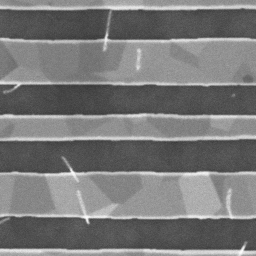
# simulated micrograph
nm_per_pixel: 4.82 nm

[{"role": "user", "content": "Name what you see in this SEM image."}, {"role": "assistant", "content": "lines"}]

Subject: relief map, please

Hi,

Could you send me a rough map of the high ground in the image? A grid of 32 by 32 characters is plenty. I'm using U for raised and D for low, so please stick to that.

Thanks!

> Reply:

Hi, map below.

UUUUUUUUUUUUUUUUUUUUUUUUUUUUUUUU
DDDDDDDDDDDDDDDDDDDDDDDDDDDDDDDD
DDDDDDDDDDDDDDDDDDDDDDDDDDDDDDDD
DDDDDDDDDDDDDDDDDDDDDDDDDDDDDDDD
DDDDDDDDDDDDDDDDDDDDDDDDDDDDDDDD
UUUUUUUUUUUUUUUUUUUUUUUUUUUUUUUU
UUUUUUUUUUUUUUUUUUUUUUUUUUUUUUUU
UUUUUUUUUUUUUUUUUUUUUUUUUUUUUUUU
UUUUUUUUUUUUUUUUUUUUUUUUUUUUUUUU
UUUUUUUUUUUUUUUUUUUUUUUUUUUUUUUU
DDDDDDDDDDDDDDDUUDDDUUUUUUUUUDUU
DDDDDDDDDDDDDDDDDDDDDDDDDDDDDDDD
DDDDDDDDDDDDDDDDDDDDDDDDDDDDDDDD
DDDDDDDDDDDDDDDDDDDDDDDDDDDDDDDD
UUDDDDDDDDDDUUUUUUUUUUUDDDDDDDDD
UUUUUUUUUUUUUUUUUUUUUUUUUUUUUUUU
UUUUUUUUUUUUUUUUUUUUUUUUUUUUUUUU
DDDDDDDDDDDDDDDDDDDDDDDDDDDDDDDD
DDDDDDDDDDDDDDDDDDDDDDDDDDDDDDDD
DDDDDDDDDDDDDDDDDDDDDDDDDDDDDDDD
DDDDDDDDDDDDDDDDDDDDDDDDDDDDDDDD
DDDDDDDDDDDDDDDDDDDDDDDDDDDDDDDD
UUUUUUUUUUUUUUUUUUUUUUUUUUUUUUUU
UUUUUUUUUUUUUUUUUUUUUUUUUUUUUUUU
UUUUUUUUUUUUUUUUUUUUUUUUUUUUUUUU
UUUUUUUUUUUUUUUUUUUUUUUUUUUUUUUU
UUUUUUUUUUUUUUUUUUUUUUUUUUUUUUUU
DDDDDDDDDDDDDDDDDDDDDDDDDDDDDDDD
DDDDDDDDDDDDDDDDDDDDDDDDDDDDDDDD
DDDDDDDDDDDDDDDDDDDDDDDDDDDDDDDD
DDDDDDDDDDDDDDDDDDDDDDDDDDDDDDDD
UUUUUUUUUUUUUUUUUUUUUUDDDDDDDDUD